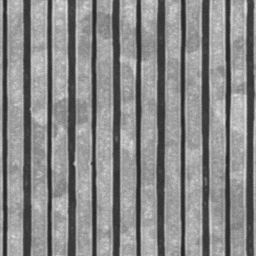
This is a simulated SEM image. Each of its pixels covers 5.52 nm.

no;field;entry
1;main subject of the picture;parallel lines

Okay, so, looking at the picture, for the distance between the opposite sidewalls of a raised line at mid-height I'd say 0.0842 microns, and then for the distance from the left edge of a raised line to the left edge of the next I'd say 123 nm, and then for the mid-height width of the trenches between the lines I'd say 0.0414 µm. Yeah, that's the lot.